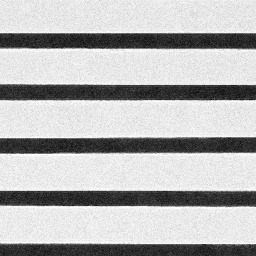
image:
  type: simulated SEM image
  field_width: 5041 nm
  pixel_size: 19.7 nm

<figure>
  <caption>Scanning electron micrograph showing lines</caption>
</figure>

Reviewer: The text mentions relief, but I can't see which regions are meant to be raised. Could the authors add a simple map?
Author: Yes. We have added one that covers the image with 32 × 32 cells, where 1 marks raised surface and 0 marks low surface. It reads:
11111111111111111111111111111111
11111111111111111111111111111111
11111111111111111111111111111111
11111111111111111111111111111111
00000000000000000000000000000000
00000000000000000000000000000000
11111111111111111111111111111111
11111111111111111111111111111111
11111111111111111111111111111111
11111111111111111111111111111111
00011111111111111111111111111111
00000000000000000000000000000000
00000000000000000000000000000000
11111111111111111111111111111111
11111111111111111111111111111111
11111111111111111111111111111111
11111111111111111111111111111111
00000000000000000000000000000000
00000000000000000000000000000000
11111111111111111111111111111111
11111111111111111111111111111111
11111111111111111111111111111111
11111111111111111111111111111111
11111111111111111111111111111111
00000000000000000000000000000000
00000000000000000000000000000000
11111111111111111111111111111111
11111111111111111111111111111111
11111111111111111111111111111111
11111111111111111111111111111111
00000000000000000000000000000000
00000000000000000000000000000000